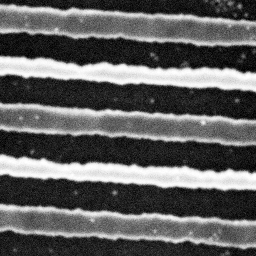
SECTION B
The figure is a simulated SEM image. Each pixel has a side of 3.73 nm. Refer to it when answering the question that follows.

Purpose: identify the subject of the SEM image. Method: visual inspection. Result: lines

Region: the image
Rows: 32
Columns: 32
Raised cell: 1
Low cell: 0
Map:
00000000000000000000000000000000
11111111111111100000000000000000
11111111111111111111111111111000
11111111111111111111111111111111
00000000011111111111111111111111
00000000000000000000000011111111
00000000000000000000000000000000
11111100000000000000000000000000
11111111111111111110000001000000
00011111111111111111111111111111
00000000000000000001111111111111
00000000000000000000000000000000
00000000000000000000000000000000
11111110000000000000000000000000
11111111111111111111111111000000
11111111111111111111111111111111
00001111111111111111111111111111
00000000000000000000111111111111
00000000000000000000000000000000
10000000000000000000000000000000
11111111010111000000000000000000
11111111111111111111111111101110
00000000001111111111111111111111
00000000000000000000000000011111
00000000000000000000000000000000
00000000000000000000000000000000
11111111111001000000000000000000
11111111111111111111111111110000
11111111111111111111111111111111
00000000101011111111111111111111
00000000000000000000000000111111
00000000000000000000000000000000